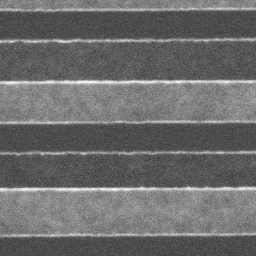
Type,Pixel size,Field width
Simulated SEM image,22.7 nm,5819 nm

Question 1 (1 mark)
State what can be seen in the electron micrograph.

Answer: lines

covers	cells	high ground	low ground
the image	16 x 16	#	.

################
################
################
................
................
################
################
################
################
###############.
................
................
################
################
################
################